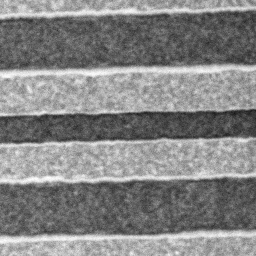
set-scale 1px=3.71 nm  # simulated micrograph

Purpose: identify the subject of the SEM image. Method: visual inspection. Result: lines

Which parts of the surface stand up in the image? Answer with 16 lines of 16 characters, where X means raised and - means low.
XXXXXXXXXXXXXXX-
----------------
----------------
----------------
------XXXXXXXXXX
XXXXXXXXXXXXXXXX
XXXXXXXXXXXXXXXX
----------------
----------------
XXXXXXXXXXXXXXXX
XXXXXXXXXXXXXXXX
----------------
----------------
----------------
----------------
XXXXXXXXXXXXXXXX